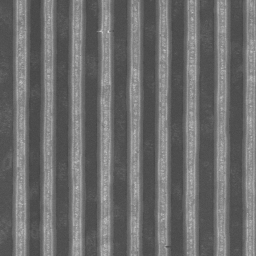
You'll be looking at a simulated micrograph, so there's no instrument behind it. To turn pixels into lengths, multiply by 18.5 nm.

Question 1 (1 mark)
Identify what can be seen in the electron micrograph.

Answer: parallel lines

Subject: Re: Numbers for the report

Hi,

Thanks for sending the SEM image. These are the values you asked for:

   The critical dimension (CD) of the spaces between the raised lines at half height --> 0.319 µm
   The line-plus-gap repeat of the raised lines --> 530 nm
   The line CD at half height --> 201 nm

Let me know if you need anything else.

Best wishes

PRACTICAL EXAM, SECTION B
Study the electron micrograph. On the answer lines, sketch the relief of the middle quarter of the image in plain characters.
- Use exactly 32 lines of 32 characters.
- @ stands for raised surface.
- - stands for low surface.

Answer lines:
--@@@----@@@-----@@-----@@-----@
--@@@----@@@-----@@-----@@-----@
--@@@----@@@-----@@-----@@-----@
--@@@----@@@----@@@-----@@-----@
--@@-----@@@----@@@-----@@-----@
--@@-----@@@----@@@-----@@-----@
--@@@----@@@----@@@-----@@-----@
--@@@----@@@----@@@-----@@-----@
--@@@----@@@----@@@-----@@-----@
--@@@----@@@----@@@-----@@-----@
--@@-----@@@----@@@-----@@-----@
--@@@----@@@----@@@-----@@-----@
--@@@----@@@----@@@-----@@----@@
--@@@----@@@-----@@-----@@----@@
--@@@----@@@-----@@-----@@----@@
--@@@----@@@-----@@-----@@----@@
--@@@----@@@-----@@-----@@----@@
--@@@----@@@-----@@-----@@----@@
--@@@----@@@-----@@-----@@-----@
--@@@----@@@-----@@-----@@-----@
--@@@----@@@-----@@-----@@-----@
--@@@----@@@-----@@-----@@-----@
--@@@----@@@-----@@-----@@-----@
--@@@----@@@-----@@-----@@-----@
--@@@----@@@-----@@----@@@-----@
--@@@----@@@-----@@----@@@-----@
--@@@----@@@-----@@----@@@-----@
--@@@----@@@-----@@----@@@-----@
--@@-----@@@-----@@-----@@-----@
--@@-----@@@-----@@-----@@-----@
--@@-----@@@----@@@-----@@-----@
--@@@----@@-----@@@-----@@-----@